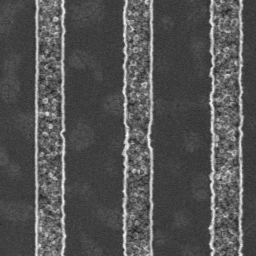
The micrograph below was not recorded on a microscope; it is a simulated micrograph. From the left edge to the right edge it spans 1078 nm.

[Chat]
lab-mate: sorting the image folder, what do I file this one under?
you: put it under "one or a few lines or trenches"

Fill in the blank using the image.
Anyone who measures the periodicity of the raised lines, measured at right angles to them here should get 373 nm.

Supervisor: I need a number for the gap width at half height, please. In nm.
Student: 254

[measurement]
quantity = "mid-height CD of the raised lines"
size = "118 nanometers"